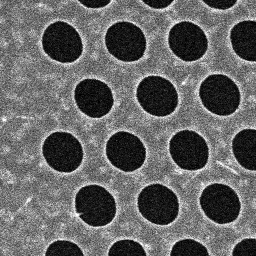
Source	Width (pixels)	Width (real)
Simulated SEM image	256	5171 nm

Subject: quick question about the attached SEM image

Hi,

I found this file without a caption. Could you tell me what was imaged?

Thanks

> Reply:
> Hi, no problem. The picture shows a regular array of holes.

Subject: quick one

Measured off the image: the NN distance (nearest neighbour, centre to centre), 62.1 px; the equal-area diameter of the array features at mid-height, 836 nm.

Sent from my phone